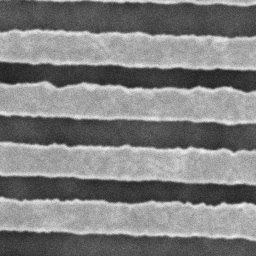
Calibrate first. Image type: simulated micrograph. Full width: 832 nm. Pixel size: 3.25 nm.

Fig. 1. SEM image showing lines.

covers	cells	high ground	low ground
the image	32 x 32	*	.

............................****
................................
................................
................................
*********************...........
********************************
********************************
********************************
........................********
................................
*.****....*.....................
******************************.*
********************************
********************************
.....***************************
............................*...
................................
................................
*******************.............
********************************
********************************
********************************
................**..************
................................
................................
****************.*******......*.
********************************
********************************
********************************
.....................***.*******
................................
................................